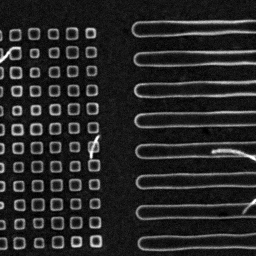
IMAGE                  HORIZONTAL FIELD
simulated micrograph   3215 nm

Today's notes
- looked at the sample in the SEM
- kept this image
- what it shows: groups of lines, slits or small figures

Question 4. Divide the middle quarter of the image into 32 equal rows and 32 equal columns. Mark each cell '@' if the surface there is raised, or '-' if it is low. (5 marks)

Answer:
--------------------------------
-@@---@@------------------------
-@@---@@------------------------
--------------------------------
--------------------------------
--@---@@----------@@@@@@@@@@@@@@
-@@@--@@----------@@@@@@@@@@@@@@
-@@@--@@----------@@@@@@@@@@@@@@
--------------------------------
--------------------------------
-@@@--@@------------------------
-@@@--@@------------------------
-@@-----------------@@@@@@@@@@@@
------------------@@@@@@@@@@@@@@
------------------@@@@@@@@@@@@@@
-@@@--@@@---------@@@@@@@@@@@@@@
-@@@--@@@-----------------------
--------------------------------
--------------------------------
-------@------------------------
--@@--@@@----------@@@@@@@@@@@@@
--@@--@@@---------@@@@@@@@@@@@@@
------@-----------@@@@@@@@@@@@@@
--------------------@@@---------
------@@@-----------------------
--@@--@@@-----------------------
--@@--@@@-----------------------
--------------------------------
------------------@@@@@@@@@@@@@@
-@@@--@@@---------@@@@@@@@@@@@@@
-@@@--@@@---------@@@@@@@@@@@@@@
--@@----------------------------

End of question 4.